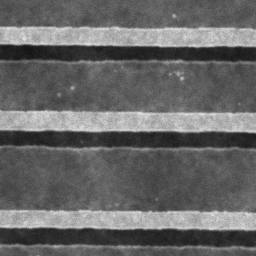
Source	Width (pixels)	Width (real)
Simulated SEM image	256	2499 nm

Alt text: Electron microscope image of lines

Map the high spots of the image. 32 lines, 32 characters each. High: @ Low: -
@@@@@@@@@@@@@@@@@@@@@@@@@@@@@@@@
@@@@@@@@@@@@@@@@@@@@@@@@@@@@@@@@
@@@@@@@@@@@@@@@@@@@@@@@@@@@@@@@@
@@@@@@@@@@@@@@@@@@@@@@@@@@@@@@@@
@@@@@@@@@@@@@@@@@@@@@@@@@@@@@@@@
-@@@@@@@@@@@@@@@@@@@@@@@@@@@@@@@
--------------------------------
--------------------------------
@@@@@@@@@@@@@@@@@@@@@@@@@@@@@@@@
@@@@@@@@@@@@@@@@@@@@@@@@@@@@@@@@
@@@@@@@@@@@@@@@@@@@@@@@@@@@@@@@@
@@@@@@@@@@@@@@@@@@@@@@@@@@@@@@@@
@@@@@@@@@@@@@@@@@@@@@@@@@@@@@@@@
@@@@@@@@@@@@@@@@@@@@@@@@@@@@@@@@
@@@@@@@@@@@@@@@@@@@@@@@@@@@@@@@@
@@@@@@@@@@@@@@@@@@@@@@@@@@@@@@@@
-------------------------------@
--------------------------------
@@@@@@@-----@--@-------------@--
@@@@@@@@@@@@@@@@@@@@@@@@@@@@@@@@
@@@@@@@@@@@@@@@@@@@@@@@@@@@@@@@@
@@@@@@@@@@@@@@@@@@@@@@@@@@@@@@@@
@@@@@@@@@@@@@@@@@@@@@@@@@@@@@@@@
@@@@@@@@@@@@@@@@@@@@@@@@@@@@@@@@
@@@@@@@@@@@@@@@@@@@@@@@@@@@@@@@@
@@@@@@@@@@@@@@@@@@@@@@@@@@@@@@@@
@@@@@@@@@@@@@@@@@@@@@@@@@@@@@@@@
@@@@@@@@@@@@@@@@@@@@@@@@@@@@@@@@
-------------@@@@@@@@-@@@@@@@@@@
--------------------------------
--------------------------------
@@@@@@@@@@@@@@@@@@@@@@@@@@@@@@@@